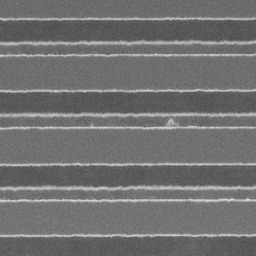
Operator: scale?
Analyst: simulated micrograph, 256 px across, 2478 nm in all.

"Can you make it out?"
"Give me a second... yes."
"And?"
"lines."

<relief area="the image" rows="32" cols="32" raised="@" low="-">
@@@@@@@@@@@@@@@@@@@@@@@@@@@@@@@@
@@@@@@@@@@@@@@@@@@@@@@@@@@@@@@@@
--------------------------------
--------------------------------
--------------------------------
@@@@@@@@@@@@@@@@@@@@@@@@@@@@@@@@
@@@@@@@@@@@@@@@@@@@@@@@@@@@@@@@@
@@@@@@@@@@@@@@@@@@@@@@@@@@@@@@@@
@@@@@@@@@@@@@@@@@@@@@@@@@@@@@@@@
@@@@@@@@@@@@@@@@@@@@@@@@@@@@@@@@
@@@@@@@@@@@@@@@@@@@@@@@@@@@@@@@@
-@-@----------------------------
--------------------------------
--------------------------------
@@@@@@@@@@@@@@@@@@@@@@@@@@@@@@@@
@@@@@@@@@@@@@@@@@@@@@@@@@@@@@@@@
@@@@@@@@@@@@@@@@@@@@@@@@@@@@@@@@
@@@@@@@@@@@@@@@@@@@@@@@@@@@@@@@@
@@@@@@@@@@@@@@@@@@@@@@@@@@@@@@@@
@@@@@@@@@@@@@@@@@@@@@@@@@@@@@@@@
@@@@@@@@@@@@@@@@@@@@@@@@@@@@@@@@
--------------------------------
--------------------------------
--------------------------------
@@@@@@@@@@@@@@@@@@@@@@@@@@@@@@@@
@@@@@@@@@@@@@@@@@@@@@@@@@@@@@@@@
@@@@@@@@@@@@@@@@@@@@@@@@@@@@@@@@
@@@@@@@@@@@@@@@@@@@@@@@@@@@@@@@@
@@@@@@@@@@@@@@@@@@@@@@@@@@@@@@@@
@@@@@@@@@-@-@@-@@-------@-------
--------------------------------
--------------------------------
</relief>